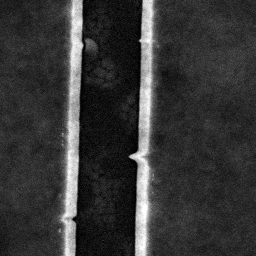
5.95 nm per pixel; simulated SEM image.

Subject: one or a few lines or trenches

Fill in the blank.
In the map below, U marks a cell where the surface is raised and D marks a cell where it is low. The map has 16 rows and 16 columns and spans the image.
UUUUUDDDDUUUUUUU
UUUUUDDDDUUUUUUU
UUUUUDDDDUUUUUUU
UUUUUDDDDUUUUUUU
UUUUUDDDDUUUUUUU
UUUUUDDDDUUUUUUU
UUUUUDDDDUUUUUUU
UUUUUDDDDUUUUUUU
UUUUUDDDDUUUUUUU
UUUUUDDDDUUUUUUU
UUUUUDDDDUUUUUUU
UUUUUDDDDUUUUUUU
UUUUDDDDDUUUUUUU
UUUUDDDDDUUUUUUU
UUUUDDDDDUUUUUUU
UUUUDDDDDUUUUUUU